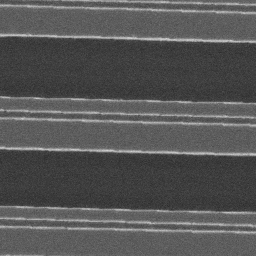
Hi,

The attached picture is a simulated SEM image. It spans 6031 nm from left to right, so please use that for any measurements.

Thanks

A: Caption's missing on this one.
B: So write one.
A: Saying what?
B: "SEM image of lines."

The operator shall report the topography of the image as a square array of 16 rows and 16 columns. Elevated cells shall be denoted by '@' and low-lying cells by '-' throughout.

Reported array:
@@@@@@@@@@@@@@@@
@@@@@@@@@@@@@@@@
--------------@@
----------------
----------------
----------------
@@@@@@@@@@@@@@@@
@@@@@@@@@@@@@@@@
@@@@@@@@@@@@@@@@
----------@@@@@@
----------------
----------------
----------------
@@@@@@@@@@@@@@@@
@@@@@@@@@@@@@@@@
@@@@@@@@@@@@@@@@